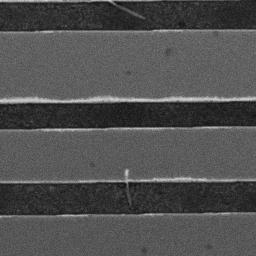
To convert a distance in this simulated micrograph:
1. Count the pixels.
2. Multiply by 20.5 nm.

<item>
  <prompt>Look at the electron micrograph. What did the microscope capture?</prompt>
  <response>lines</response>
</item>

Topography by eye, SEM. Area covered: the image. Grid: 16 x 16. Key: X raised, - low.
----------------
----------------
XXXXXXXXXXXXXXXX
XXXXXXXXXXXXXXXX
XXXXXXXXXXXXXXXX
XXXXXXXXXXXXXXXX
----------------
----------------
XXXXXXXXXXXXXXXX
XXXXXXXXXXXXXXXX
XXXXXXXXXXXXXXXX
----------------
----------------
---XXXXXXXXXXXXX
XXXXXXXXXXXXXXXX
XXXXXXXXXXXXXXXX